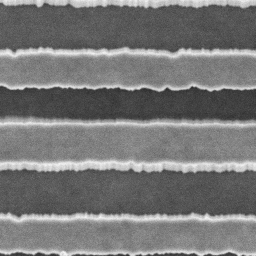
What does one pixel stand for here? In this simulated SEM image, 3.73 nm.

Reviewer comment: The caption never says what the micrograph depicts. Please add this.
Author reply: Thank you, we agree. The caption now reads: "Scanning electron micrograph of lines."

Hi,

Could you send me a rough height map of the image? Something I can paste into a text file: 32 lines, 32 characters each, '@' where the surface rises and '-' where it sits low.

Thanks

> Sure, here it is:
--------------------------------
--------------------------------
--------------------------------
--------------------------------
--------------------------------
--------------------------------
@--@@@@@--@@@-@@@@@----@-@-@@@@-
@@@@@@@@@@@@@@@@@@@@@@@@@@@@@@@@
@@@@@@@@@@@@@@@@@@@@@@@@@@@@@@@@
@@@@@@@@@@@@@@@@@@@@@@@@@@@@@@@@
@@@@@@@@@@@@@@@@@@@@@@@@@@@@@@@@
--------------------------------
--------------------------------
--------------------------------
--------------------------------
@@@@@@@@@@@@@@@@@@@@@@@@@@@@-@-@
@@@@@@@@@@@@@@@@@@@@@@@@@@@@@@@@
@@@@@@@@@@@@@@@@@@@@@@@@@@@@@@@@
@@@@@@@@@@@@@@@@@@@@@@@@@@@@@@@@
@@@@@@@@@@@@@@@@@@@@@@@@@@@@@@@@
@@@@@@@@@@@@@@@@@@@@@@@@@@@@@@@@
--------------------------------
--------------------------------
--------------------------------
--------------------------------
--------------------------------
--------------------------------
@@@@@@@@@@@@@@@@@@@@@@@@@@@@@@@@
@@@@@@@@@@@@@@@@@@@@@@@@@@@@@@@@
@@@@@@@@@@@@@@@@@@@@@@@@@@@@@@@@
@@@@@@@@@@@@@@@@@@@@@@@@@@@@@@@@
@@@@@@@@@@@@@@@@@@@@@@@@@@@@@@@@